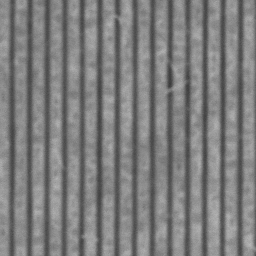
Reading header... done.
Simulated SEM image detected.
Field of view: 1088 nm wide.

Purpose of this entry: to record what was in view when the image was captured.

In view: parallel lines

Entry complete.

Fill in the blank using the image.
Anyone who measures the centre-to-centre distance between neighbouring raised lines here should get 74.4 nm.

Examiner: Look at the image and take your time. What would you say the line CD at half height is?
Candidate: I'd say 48.8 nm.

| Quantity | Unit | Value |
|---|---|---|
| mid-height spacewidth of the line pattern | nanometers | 26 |